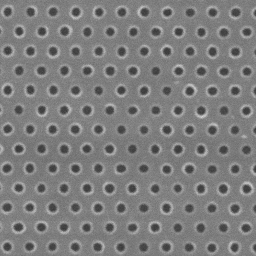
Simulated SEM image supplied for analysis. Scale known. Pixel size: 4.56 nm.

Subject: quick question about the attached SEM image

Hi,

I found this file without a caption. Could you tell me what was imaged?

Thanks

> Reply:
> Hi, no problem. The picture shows a regular array of holes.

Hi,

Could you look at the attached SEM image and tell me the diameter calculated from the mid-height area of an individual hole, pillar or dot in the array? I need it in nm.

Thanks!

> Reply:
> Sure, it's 40.2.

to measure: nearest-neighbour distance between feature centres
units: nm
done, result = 102